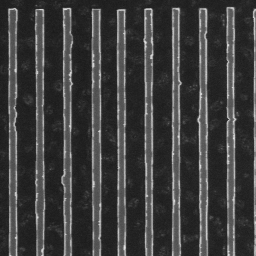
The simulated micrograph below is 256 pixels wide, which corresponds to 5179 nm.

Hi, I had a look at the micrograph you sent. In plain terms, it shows parallel lines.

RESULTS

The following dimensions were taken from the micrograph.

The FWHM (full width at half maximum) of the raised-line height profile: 157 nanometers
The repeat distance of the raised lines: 27.2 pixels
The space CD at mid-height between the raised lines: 20.4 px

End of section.